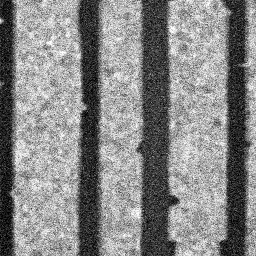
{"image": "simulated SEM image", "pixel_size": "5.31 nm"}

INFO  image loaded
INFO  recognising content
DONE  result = one or a few lines or trenches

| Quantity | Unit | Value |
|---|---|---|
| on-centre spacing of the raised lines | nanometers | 402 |